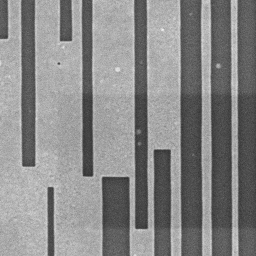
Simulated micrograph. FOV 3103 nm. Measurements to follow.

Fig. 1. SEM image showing groups of lines, slits or small figures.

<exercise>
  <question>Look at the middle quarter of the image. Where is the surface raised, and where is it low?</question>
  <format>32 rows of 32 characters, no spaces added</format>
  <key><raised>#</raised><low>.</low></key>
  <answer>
####...##########....########...
####...##########....########...
####...##########....########...
####...##########....########...
####...##########....########...
####...##########....########...
####...##########....########...
####...##########....########...
####...##########....########...
####...##########....########...
####...##########....########...
####...##########....########...
####...##########....########...
####...##########....########...
####...##########....########...
####...##########....########...
####...##########.#..########...
####...##########.#..########...
####...##########....########...
####...##########....########...
####...##########....########...
####...##########....##....##...
####...##########....#.....##...
####...##########....#.....##...
####....#########....#.....##...
####....##########...#.....##...
####....##########...#.....##...
####....##########...#.....##...
#########.......##...#.....##...
#########........#...#.....##...
#########........#...#.....##...
#########........#...#.....##...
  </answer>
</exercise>